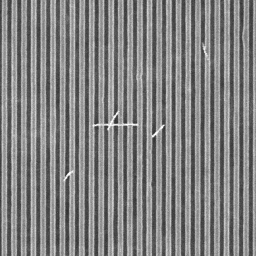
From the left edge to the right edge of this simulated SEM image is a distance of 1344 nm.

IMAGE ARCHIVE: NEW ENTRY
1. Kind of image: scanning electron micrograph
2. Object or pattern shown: parallel lines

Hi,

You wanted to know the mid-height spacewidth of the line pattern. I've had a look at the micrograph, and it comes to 26.3 nm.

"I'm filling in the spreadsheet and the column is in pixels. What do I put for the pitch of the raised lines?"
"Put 9.66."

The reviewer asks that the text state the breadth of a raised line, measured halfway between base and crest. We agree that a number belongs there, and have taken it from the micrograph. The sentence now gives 26.3 nm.